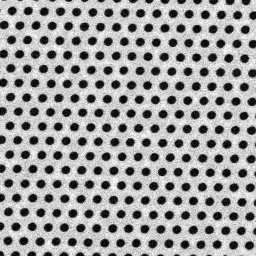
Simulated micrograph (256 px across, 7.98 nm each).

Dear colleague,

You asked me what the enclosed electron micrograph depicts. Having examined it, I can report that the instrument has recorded a regular array of holes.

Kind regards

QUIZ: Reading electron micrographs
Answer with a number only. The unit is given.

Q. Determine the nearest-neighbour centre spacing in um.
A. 0.127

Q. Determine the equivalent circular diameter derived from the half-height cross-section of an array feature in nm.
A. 68